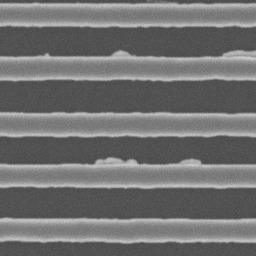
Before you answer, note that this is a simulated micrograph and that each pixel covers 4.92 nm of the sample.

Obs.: lines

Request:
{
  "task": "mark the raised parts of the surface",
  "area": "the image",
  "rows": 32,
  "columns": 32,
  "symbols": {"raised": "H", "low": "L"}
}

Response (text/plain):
HHHHHHHHHHHHHHHHHHHHHHHLHHLHHHHH
HHHHHHHHHHHHHHHHHHHHHHHHHHHHHHHH
HHHHHHHHHHHHHHHHHHHHHHHHHHHHHHHH
LLLLLLLLLLLLLLLLLLLLLLLLLLLLLLLL
LLLLLLLLLLLLLLLLLLLLLLLLLLLLLLLL
LLLLLLLLLLLLLLLLLLLLLLLLLLLLLLLL
LLLLLLLLLLLLLLLLLLLLLLLLLLLLLLLL
HHHHHHHHHHHHHHHHHHHHHHHHHHHHHHHH
HHHHHHHHHHHHHHHHHHHHHHHHHHHHHHHH
HHHHHHHHHHHHHHHHHHHHHHHHHHHHHHHH
LLLLLLLLLLLLLLLLLLLLLLLLLLLLLLLL
LLLLLLLLLLLLLLLLLLLLLLLLLLLLLLLL
LLLLLLLLLLLLLLLLLLLLLLLLLLLLLLLL
LLLLLLLLLLLLLLLLLLLLLLLLLLLLLLLL
HHHHHHHHHHHHHHHHHHHHHHHHHHHHHHHH
HHHHHHHHHHHHHHHHHHHHHHHHHHHHHHHH
HHHHHHHHHHHHHHHHHHHHHHHHHHHHHHHH
LLLLLLLLLLLLLLLLLLLLLLLLLLLLLLLL
LLLLLLLLLLLLLLLLLLLLLLLLLLLLLLLL
LLLLLLLLLLLLLLLLLLLLLLLLLLLLLLLL
LLLLLLLLLLLLLHHLLLLLLLLLLLLLLLLL
HHHHHHHHHHHHHHHHHHHHHHHHHHHHHHHH
HHHHHHHHHHHHHHHHHHHHHHHHHHHHHHHH
LLLLLLLLLLLLLLLLLHHHLLLLLLLHHLLL
LLLLLLLLLLLLLLLLLLLLLLLLLLLLLLLL
LLLLLLLLLLLLLLLLLLLLLLLLLLLLLLLL
LLLLLLLLLLLLLLLLLLLLLLLLLLLLLLLL
HHHHHHHHHHHHHHLLHHHHHHHHLLLLLLHH
HHHHHHHHHHHHHHHHHHHHHHHHHHHHHHHH
HHHHHHHHHHHHHHHHHHHHHHHHHHHHHHHH
LLLLLLLLLLLLLLLLLLLLLLLLLLLLLLLL
LLLLLLLLLLLLLLLLLLLLLLLLLLLLLLLL